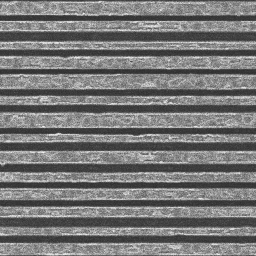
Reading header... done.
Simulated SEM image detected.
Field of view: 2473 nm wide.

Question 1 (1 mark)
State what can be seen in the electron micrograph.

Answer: parallel lines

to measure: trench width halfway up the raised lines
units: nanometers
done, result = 61.6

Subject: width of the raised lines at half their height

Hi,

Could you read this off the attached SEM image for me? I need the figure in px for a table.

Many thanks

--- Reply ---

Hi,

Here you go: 11.9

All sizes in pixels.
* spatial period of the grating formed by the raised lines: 18.6